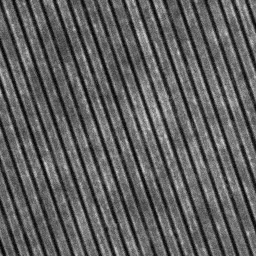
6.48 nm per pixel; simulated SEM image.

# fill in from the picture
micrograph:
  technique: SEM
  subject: parallel lines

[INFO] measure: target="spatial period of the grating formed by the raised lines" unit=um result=0.0841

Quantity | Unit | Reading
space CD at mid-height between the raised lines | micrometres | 0.0322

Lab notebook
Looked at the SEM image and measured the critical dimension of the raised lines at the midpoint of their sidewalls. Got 53.6 nm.